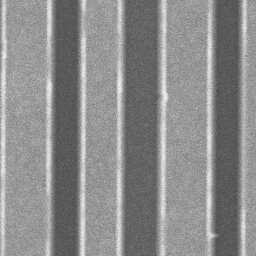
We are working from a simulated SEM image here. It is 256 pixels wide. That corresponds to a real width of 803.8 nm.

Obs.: one or a few lines or trenches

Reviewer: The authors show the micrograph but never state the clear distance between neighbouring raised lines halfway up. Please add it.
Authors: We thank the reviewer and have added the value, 87 nanometers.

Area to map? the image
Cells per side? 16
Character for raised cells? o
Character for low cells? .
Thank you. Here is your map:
ooo..ooo..ooo..o
ooo..ooo..ooo..o
ooo..ooo..ooo..o
ooo..ooo..ooo..o
ooo..ooo..ooo..o
ooo..ooo..ooo..o
ooo..ooo..ooo..o
ooo..ooo..ooo..o
ooo..ooo..ooo..o
ooo..ooo..ooo..o
ooo..ooo..ooo..o
ooo..ooo..ooo..o
ooo..ooo..ooo..o
ooo..ooo..ooo..o
ooo..ooo..ooo..o
ooo..ooo..ooo..o